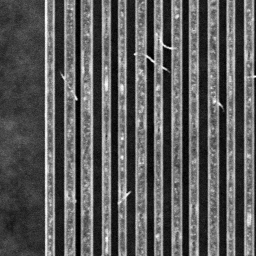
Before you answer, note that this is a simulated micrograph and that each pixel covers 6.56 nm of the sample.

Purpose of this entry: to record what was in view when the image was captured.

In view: parallel lines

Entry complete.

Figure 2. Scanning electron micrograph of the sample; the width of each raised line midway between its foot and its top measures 61.5 nanometres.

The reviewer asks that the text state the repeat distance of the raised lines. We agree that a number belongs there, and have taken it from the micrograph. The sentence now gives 119 nanometres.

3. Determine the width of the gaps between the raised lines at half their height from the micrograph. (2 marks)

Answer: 61.5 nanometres